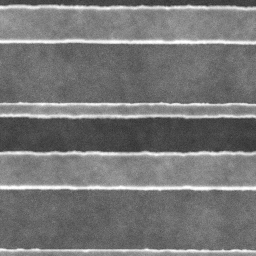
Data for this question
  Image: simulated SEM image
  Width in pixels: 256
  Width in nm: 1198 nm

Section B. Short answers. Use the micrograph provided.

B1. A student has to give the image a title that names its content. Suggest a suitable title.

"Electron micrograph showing lines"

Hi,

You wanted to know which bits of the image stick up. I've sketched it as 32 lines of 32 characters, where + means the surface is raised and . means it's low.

................................
++++++++++++++++++++++++++++++++
++++++++++++++++++++++++++++++++
++++++++++++++++++++++++++++++++
++++++++++++++++++++++++++++++++
................................
................................
................................
................................
................................
................................
................................
................................
++++++++++++++++++++++++++++++++
....+++.++++..+++++...++++++++++
................................
................................
................................
................................
++++++++++++++++++++++++++++++++
++++++++++++++++++++++++++++++++
++++++++++++++++++++++++++++++++
++++++++++++++++++++++++++++++++
.................++++...++++++++
................................
................................
................................
................................
................................
................................
................................
++++++++++++++++++++++++++++++++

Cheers